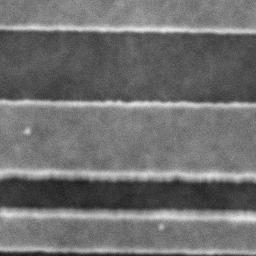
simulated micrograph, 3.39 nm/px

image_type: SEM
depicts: lines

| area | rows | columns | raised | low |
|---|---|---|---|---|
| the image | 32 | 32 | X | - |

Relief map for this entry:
XXXXXXXXXXXXXXXXXXXXXXXXXXXXXXXX
XXXXXXXXXXXXXXXXXXXXXXXXXXXXXXXX
XXXXXXXXXXXXXXXXXXXXXXXXXXXXXXXX
XXXXXXXXXXXXXXXXXXXXXXXXXXXXXXXX
--------------------------------
--------------------------------
--------------------------------
--------------------------------
--------------------------------
--------------------------------
--------------------------------
--------------------------------
--------------------------------
XXXXXXXXXXXXXXXXXXXXXXXXXXXXXXXX
XXXXXXXXXXXXXXXXXXXXXXXXXXXXXXXX
XXXXXXXXXXXXXXXXXXXXXXXXXXXXXXXX
XXXXXXXXXXXXXXXXXXXXXXXXXXXXXXXX
XXXXXXXXXXXXXXXXXXXXXXXXXXXXXXXX
XXXXXXXXXXXXXXXXXXXXXXXXXXXXXXXX
XXXXXXXXXXXXXXXXXXXXXXXXXXXXXXXX
XXXXXXXXXXXXXXXXXXXXXXXXXXXXXXXX
XXXXXXXXXXXXXXXXXXXXXXXXXXXXXXXX
--------------------------------
--------------------------------
--------------------------------
--------------------------------
X-------------------------------
XXXXXXXXXXXXXXXXXXXXXXXXXXXXXXXX
XXXXXXXXXXXXXXXXXXXXXXXXXXXXXXXX
XXXXXXXXXXXXXXXXXXXXXXXXXXXXXXXX
XXXXXXXXXXXXXXXXXXXXXXXXXXXXXXXX
----------XXXXXXXXXXXXXXXXXXXXXX